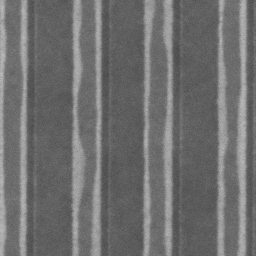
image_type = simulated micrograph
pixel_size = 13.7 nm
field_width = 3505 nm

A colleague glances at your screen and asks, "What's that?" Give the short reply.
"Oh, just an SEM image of lines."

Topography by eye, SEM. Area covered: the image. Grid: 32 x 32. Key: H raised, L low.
HHHLLLLLLHHHLLLLLLHHHLLLLLLLHHHL
HHHLLLLLLHHHLLLLLLHHHLLLLLLLHHHL
HHHLLLLLLHHHLLLLLLHHHLLLLLLLHHHL
HHHLLLLLLHHHLLLLLLHHHLLLLLLHHHHL
HHHLLLLLLHHHLLLLLLHHHLLLLLLHHHHL
HHHLLLLLLHHHLLLLLLHHHLLLLLLHHHLL
HHHLLLLLLHHHLLLLLLHHHLLLLLLHHHHL
HHHLLLLLLHHHLLLLLLHHHLLLLLLHHHHL
HHHLLLLLLHHHLLLLLLHHHLLLLLLLHHHL
HHHLLLLLLHHHLLLLLLHHHLLLLLLLHHHL
HHHLLLLLLHHHLLLLLLHHHLLLLLLLHHHL
HHHLLLLLLHHHLLLLLLHHHLLLLLLLHHHL
HHHLLLLLLHHHLLLLLLHHHLLLLLLHHHLL
HHHLLLLLLHHHLLLLLLHHHLLLLLLLHHLL
HHHLLLLLLHHHLLLLLLHHHLLLLLLLHHLL
HHHLLLLLLHHHLLLLLLHHHLLLLLLLHHLL
HHHLLLLLLHHHLLLLLLHHHLLLLLLLHHLL
HHHLLLLLLHHHLLLLLLHHHLLLLLLLHHLL
HHHLLLLLLHHHLLLLLLHHHLLLLLLLHHLL
HHHLLLLLLHHHLLLLLLHHHLLLLLLHHHLL
HHHLLLLLLHHHLLLLLLHHHLLLLLLHHHLL
HHHLLLLLLHHHLLLLLLHHHLLLLLLHHHLL
HHHLLLLLLHHHLLLLLLHHHLLLLLLHHHLL
HHHLLLLLLHHHLLLLLLHHHLLLLLLHHHLL
HHHLLLLLLHHHLLLLLLHHHLLLLLLHHHLL
HHHLLLLLLHHHLLLLLLHHHLLLLLLHHHLL
HHHLLLLLLHHHLLLLLLHHHLLLLLLHHHLL
HHHLLLLLLHHHLLLLLLHHHLLLLLLHHHLL
HHHLLLLLLHHHLLLLLLHHHLLLLLLHHHLL
HHHLLLLLLHHHLLLLLLHHHLLLLLLHHHLL
HHHLLLLLLHHHLLLLLLHHHLLLLLLHHHLL
HHHLLLLLLHHHLLLLLLHHHLLLLLLHHHLL